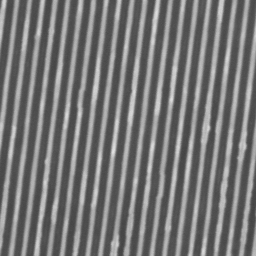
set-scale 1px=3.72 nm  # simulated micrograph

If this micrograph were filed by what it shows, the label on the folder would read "parallel lines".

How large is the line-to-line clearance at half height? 28.6 nanometers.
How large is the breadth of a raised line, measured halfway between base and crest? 17.5 nm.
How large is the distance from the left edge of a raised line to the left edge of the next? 47.3 nm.